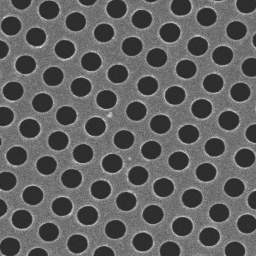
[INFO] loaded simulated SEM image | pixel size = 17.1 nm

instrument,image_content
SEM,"a regular array of holes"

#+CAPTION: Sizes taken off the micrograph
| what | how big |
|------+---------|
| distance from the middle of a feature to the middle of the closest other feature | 476 nanometres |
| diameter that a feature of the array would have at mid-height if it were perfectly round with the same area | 330 nanometres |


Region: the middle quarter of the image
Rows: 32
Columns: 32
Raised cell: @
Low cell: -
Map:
@@@@@----@@@---@@@@@@@--@@@@----
@@@@@@--@@@-----@@@@@@@@@@@@----
@@@@@@@@@@@-----@@@@@@@@@@@@----
@@@@-@@@@@@-----@@@@--@@@@@@@@--
@@----@@@@@@---@@@@----@@@@@@@@@
@@-----@@@@@@@@@@@-----@@@@@@@@@
@@-----@@@-@@@@@@@@----@@@----@@
@@----@@@----@@@@@@@--@@@-----@@
@@@@@@@@-----@@@@@@@@@@@@-----@@
@@@@@@@@-----@@@@--@@@@@@@---@@@
@@@@@@@@@---@@@@----@@@@@@@@@@@@
---@@@@@@@@@@@@@-----@@@@@@@@@@@
---@@@@@@@@@@@@@----@@@@@@@@@@@@
---@@@@--@@@@@@@----@@----@@@@@@
--@@@@----@@@@@@@@@@@@-----@@@@@
@@@@@-----@@@@@@@@@@@@-----@@@--
@@@@@@----@@@@@@@@@@@@----@@@---
@@@@@@---@@@@----@@@@@@@@@@@@---
-@@@@@@@@@@@@-----@@@@@@@@@@@---
-@@@@@@@@@@@@----@@@@--@@@@@@@--
-@@---@@@@@@@----@@@----@@@@@@@@
@@-----@@@@@@@@@@@@-----@@@@@@@@
@@-----@@@@@-@@@@@@-----@@@---@@
@@@----@@@----@@@@@@@--@@@-----@
@@@@--@@@@-----@@@@@@@@@@@-----@
@@@@@@@@@@-----@@@@@@@@@@@@----@
@--@@@@@@@----@@@----@@@@@@@-@@@
----@@@@@@@@@@@@-----@@@@@@@@@@@
-----@@@@@@@@@@@-----@@@@@@@@@@@
----@@@@---@@@@@@---@@@----@@@@@
----@@@----@@@@@@@@@@@-----@@@@@
@@@@@@@-----@@@@@@@@@@@----@@@@-